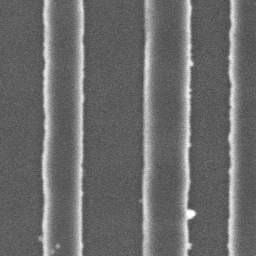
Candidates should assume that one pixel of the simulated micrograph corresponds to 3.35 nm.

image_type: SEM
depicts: lines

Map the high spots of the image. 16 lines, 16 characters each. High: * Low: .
...**....***..**
...**....***..**
...**....***..**
...**....***..**
...**....***..**
...**....***..**
...**....***..**
...**....***..**
...**....***..**
...**....***..**
...**....***..**
...**....***..**
...**....***..**
...**....***..**
...**....***..**
...**....***..**